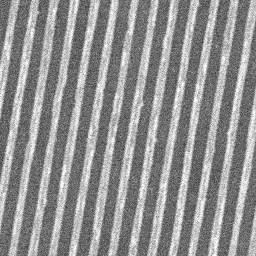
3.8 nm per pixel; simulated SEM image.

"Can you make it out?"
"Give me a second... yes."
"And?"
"parallel lines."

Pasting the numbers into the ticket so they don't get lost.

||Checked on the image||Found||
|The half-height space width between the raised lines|48.7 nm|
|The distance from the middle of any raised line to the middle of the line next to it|0.0747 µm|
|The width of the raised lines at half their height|26.3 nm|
